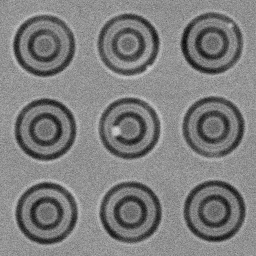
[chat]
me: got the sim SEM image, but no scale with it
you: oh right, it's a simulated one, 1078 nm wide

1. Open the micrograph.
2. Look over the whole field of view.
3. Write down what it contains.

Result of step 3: an array of small figures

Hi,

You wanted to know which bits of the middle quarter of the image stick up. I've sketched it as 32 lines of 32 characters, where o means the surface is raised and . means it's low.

.ooooooooo...ooooo....ooooooooo.
ooooooooooo..........ooooooooooo
ooooooooooooo.......oooooooooooo
oooooooooooooooooooooooooooooooo
oooooooooooooooooooooooooooooooo
oooooooooooooooooooooooooooooooo
oooooooooooooooooooooooooooooooo
oooooooooooooooooooooooooooooooo
oooooooooooooo.....ooooooooooooo
oooooooooooo.........ooooooooooo
.oooooooooo...oooo....ooooooooo.
..oooooooo...ooooooo...oooooooo.
..ooooooo..ooo.....oo...oooooo..
o..oooooo..oo.......o...oooooo..
o..oooooo..o..oooo...o..ooooo...
o..ooooo..oo..ooooo..o..ooooo..o
o..ooooo..ooooooooo..o..ooooo..o
o..oooooo..ooooooo...o..oooooo..
o..oooooo..oo...o...oo..oooooo..
o..oooooo..ooo.....oo...oooooo..
..oooooooo..oooo.ooo...oooooooo.
..oooooooo....ooooo...oooooooooo
.ooooooooooo.........ooooooooooo
ooooooooooooo......ooooooooooooo
oooooooooooooooooooooooooooooooo
oooooooooooooooooooooooooooooooo
oooooooooooooooooooooooooooooooo
oooooooooooooooooooooooooooooooo
oooooooooooooooooooooooooooooooo
oooooooooooooo.....ooooooooooooo
oooooooooooo.........ooooooooooo
.oooooooooo....oooo...oooooooooo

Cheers